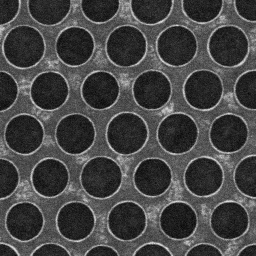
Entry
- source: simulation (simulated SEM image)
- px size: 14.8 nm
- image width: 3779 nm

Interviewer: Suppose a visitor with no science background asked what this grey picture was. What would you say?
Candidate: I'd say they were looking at a regular array of holes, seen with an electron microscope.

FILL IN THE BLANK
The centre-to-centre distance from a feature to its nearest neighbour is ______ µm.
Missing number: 0.744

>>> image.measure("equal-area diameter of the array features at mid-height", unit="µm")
0.572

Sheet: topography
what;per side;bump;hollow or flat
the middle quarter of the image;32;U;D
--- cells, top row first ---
UUDUUUUUUUUUUUDDDUUUUUUUUUUUUUUU
UUUUUUUUUUUUUUUUUUUUUDDUUUUUUUUU
UUUUUUUDDDDDUUUUUUUDDDDDDUUUUUUU
UUUUUUDDDDDDDUUUUUDDDDDDDDUUUUUD
DUUUUDDDDDDDDUUUUUDDDDDDDDUUUUDD
DUUUDDDDDDDDDDUUUDDDDDDDDDDUUUDD
DUUUDDDDDDDDDDUUUDDDDDDDDDDUUUDD
DUUUDDDDDDDDDDUUUDDDDDDDDDDUUUDD
DUUUUDDDDDDDDUUUUUDDDDDDDDUUUUDD
UUUUUDDDDDDDDUUUUUDDDDDDDDUUUUUD
UUUUUUUDDDDDUUUUUUUDDDDDDUUUUUUU
UUUUUUUUUUUUUUUUUUUUUUUUUUUUUUUU
UUUDUUUUUUUUUUDDDDUUUUUUUUUDDDUU
DDDDDDUUUUUUDDDDDDDUUUUUUDDDDDDD
DDDDDDDUUUUUDDDDDDDDUUUUDDDDDDDD
DDDDDDDUUUUDDDDDDDDDDUUUDDDDDDDD
DDDDDDDDUUUDDDDDDDDDDUUDDDDDDDDD
DDDDDDDDUUDDDDDDDDDDDUUDDDDDDDDD
DDDDDDDDUUUDDDDDDDDDDUUDDDDDDDDD
DDDDDDDUUUUDDDDDDDDDUUUUDDDDDDDD
DDDDDDDUUUUDDDDDDDDDUUUUDDDDDDDD
DDDDDDUUUUUUDDDDDDDUUUUUUDDDDDDU
UDDDUUUUUUUUUUDDDUUUUUUUUUUUDUUU
UUUUUUUDDDDUUUUUUUUUUUUUUUUUUUUU
UUUUUUDDDDDDDUUUUUUDDDDDDUUUUUUU
UUUUUDDDDDDDDDUUUUUDDDDDDDUUUUUD
DUUUUDDDDDDDDDUUUUDDDDDDDDDUUUDD
DUUUDDDDDDDDDDUUUUDDDDDDDDDUUUDD
DUUUDDDDDDDDDDDUUDDDDDDDDDDUUUDD
DUUUDDDDDDDDDDUUUUDDDDDDDDDUUUDD
DUUUUDDDDDDDDDUUUUDDDDDDDDUUUUUD
UUUUUDDDDDDDDUUUUUDDDDDDDDUUUUUD